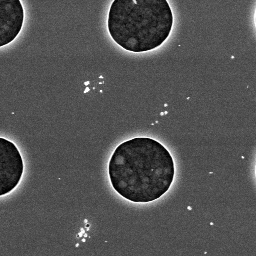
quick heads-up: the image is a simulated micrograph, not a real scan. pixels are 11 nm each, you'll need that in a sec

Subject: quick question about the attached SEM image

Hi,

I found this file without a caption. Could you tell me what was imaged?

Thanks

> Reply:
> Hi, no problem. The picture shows holes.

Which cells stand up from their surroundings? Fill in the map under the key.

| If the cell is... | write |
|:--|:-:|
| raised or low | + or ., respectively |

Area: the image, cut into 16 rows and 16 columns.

.++++++....+++++
.++++++....+++++
.++++++...++++++
++++++++++++++++
++++++++++++++++
++++++++++++++++
++++++++++++++++
++++++++++++++++
++++++++++++++++
.++++++....+++++
.++++++....+++++
.++++++....+++++
++++++++..++++++
++++++++++++++++
++++++++++++++++
++++++++++++++++